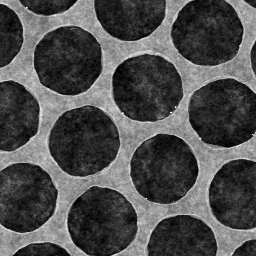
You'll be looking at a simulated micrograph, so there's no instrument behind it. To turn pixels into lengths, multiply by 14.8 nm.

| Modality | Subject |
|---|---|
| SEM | holes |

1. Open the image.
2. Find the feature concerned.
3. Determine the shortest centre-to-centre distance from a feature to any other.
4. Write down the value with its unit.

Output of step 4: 1220 nm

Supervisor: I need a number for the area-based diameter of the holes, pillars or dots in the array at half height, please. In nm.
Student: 1030